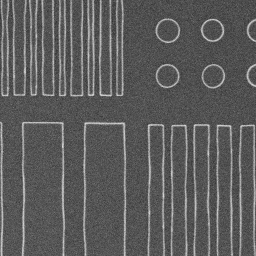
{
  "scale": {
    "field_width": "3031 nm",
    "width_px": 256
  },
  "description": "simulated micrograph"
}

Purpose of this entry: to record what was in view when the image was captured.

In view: groups of lines, slits or small figures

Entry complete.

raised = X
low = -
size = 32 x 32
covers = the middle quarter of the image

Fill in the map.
--XX--X--XXX-XX----------XX-----
--XXX-X--XXX-XX---------XXXX----
--XXX-X--XXX-XX--------XXXXXX---
--XXX-X--XXX-XX--------XXXXXX---
--XXX-X--XXX-XX--------XXXXX----
--XXX-X--XXX-XX---------XXX-----
--XXX-X--XXX-XX-----------------
--XXX-X--XXX-XX-----------------
--------------------------------
--------------------------------
--------------------------------
--------------------------------
--------------------------------
--------------------------------
--------------------------------
-----XXXXXXXXXX------XXXX--XXX--
-----XXXXXXXXXX------XXXX--XXX--
-----XXXXXXXXXX------XXXX--XXXX-
-----XXXXXXXXXX------XXXX--XXXX-
-----XXXXXXXXXX------XXXX--XXXX-
-----XXXXXXXXXX------XXXX--XXXX-
-----XXXXXXXXXX------XXXX--XXXX-
-----XXXXXXXXXX------XXXX--XXXX-
-----XXXXXXXXXX------XXXX--XXXX-
-----XXXXXXXXXX------XXXX--XXXX-
-----XXXXXXXXXX-------XXX--XXXX-
-----XXXXXXXXXX-------XXX--XXXX-
-----XXXXXXXXXX-------XXX--XXX--
-----XXXXXXXXXX-------XXX--XXX--
-----XXXXXXXXXX------XXXX--XXX--
-----XXXXXXXXXX------XXXX--XXX--
-----XXXXXXXXXX------XXXX--XXX--